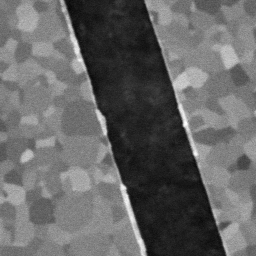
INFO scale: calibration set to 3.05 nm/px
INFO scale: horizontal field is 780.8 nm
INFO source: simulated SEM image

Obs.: one or a few lines or trenches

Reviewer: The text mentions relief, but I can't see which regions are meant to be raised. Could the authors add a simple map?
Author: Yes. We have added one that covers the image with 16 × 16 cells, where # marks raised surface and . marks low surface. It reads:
####.....#######
####......######
#####.....######
#####.....######
#####.....######
######.....#####
######.....#####
#######....#####
#######.....####
#######.....####
#######.....####
########.....###
########.....###
########.....###
#########.....##
#########.....##